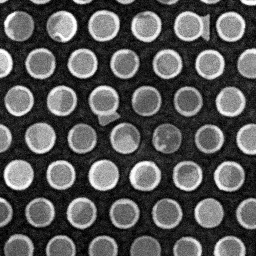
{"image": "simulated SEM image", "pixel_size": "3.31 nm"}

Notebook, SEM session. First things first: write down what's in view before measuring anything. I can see a regular array of raised bodies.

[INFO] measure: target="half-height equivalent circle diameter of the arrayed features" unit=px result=29.3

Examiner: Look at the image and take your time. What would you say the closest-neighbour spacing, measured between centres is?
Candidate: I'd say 139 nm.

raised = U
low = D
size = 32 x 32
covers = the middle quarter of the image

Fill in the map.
DUUUUUUUDDDDUUUUUUUDDDUUUUUUUDDD
DUUUUUUUDDDDUUUUUUDDDDDUUUUUUDDD
DDUUUUUDDDDDDUUUUUDDDDDUUUUUDDDD
DDDDDDDDDDDDDDUUDDDDDDDDDUUDDDDD
DDDDDDDDDDDDDDDDDDDDDDDDDDDDDDDD
DDDDDDDDDDDDDDDDDDDDDDDDDDDDDDDD
UUDDDDDDUUUUDDDDDDUUUUUDDDDDDUUU
UUUDDDDUUUUUUDDDDDUUUUUUDDDDUUUU
UUUDDDDUUUUUUDDDDUUUUUUUDDDDUUUU
UUUDDDUUUUUUUDDDDUUUUUUUDDDDUUUU
UUUDDDDUUUUUUDDDDUUUUUUUDDDDUUUU
UUDDDDDUUUUUUDDDDDUUUUUDDDDDUUUU
UDDDDDDDUUUUDDDDDDDUUUDDDDDDDDUU
DDDDDDDDDDDDDDDDDDDDDDDDDDDDDDDD
DDDDDDDDDDDDDDDDDDDDDDDDDDDDDDDD
DDDUUUDDDDDDDUUUUDDDDDDDDDDDDDDD
DDUUUUUDDDDDUUUUUUDDDDDDDDDDDDDD
DUUUUUUUDDDDUUUUUUUDDDDDDDDDDDDD
DUUUUUUUDDDDUUUUUUUDDDDDDDDDDDDD
DUUUUUUUDDDDUUUUUUUDDDDDDDDDDDDD
DDUUUUUDDDDDUUUUUUDDDDDUUDDDDDDD
DDDUUUUDDDDDDUUUUDDDDDDUDDDDDDDD
DDDDDDDDDDDDDDDDDDDDDDDDDDDDDDDD
DDDDDDDDDDDDDDDDDDDDDDDDDDDDDDDD
UDDDDDDDDUUDDDDDDDDUUUDDDDDDDUUU
UUDDDDDUUUUUUDDDDDUUUUUDDDDDUUUU
UUDDDDDUUUUUUDDDDUUUUUUUDDDUUUUU
UUUDDDUUUUUUUUDDDUUUUUUUDDDUUUUU
UUUDDDUUUUUUUUDDUUUUUUUUDDDUUUUU
UUDDDDDUUUUUUDDDDUUUUUUUDDDDUUUU
UDDDDDDUUUUUDDDDDUUUUUUDDDDDUUUU
DDDDDDDDDUUDDDDDDDDUUUDDDDDDDDDD